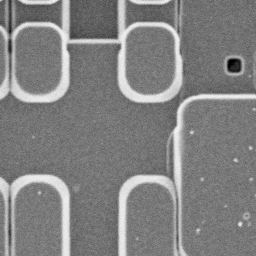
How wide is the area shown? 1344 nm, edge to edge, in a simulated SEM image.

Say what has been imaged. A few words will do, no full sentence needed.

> wiring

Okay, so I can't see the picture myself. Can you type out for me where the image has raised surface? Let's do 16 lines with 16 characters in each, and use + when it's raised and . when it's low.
................
................
++++....+++.....
++++....+++.....
++++....+++.....
.+++....+++.....
...........+++++
...........+++++
...........+++++
...........+++++
...........+++++
.+++....++++++++
++++....++++++++
++++....++++++++
++++....++++++++
++++....++++++++